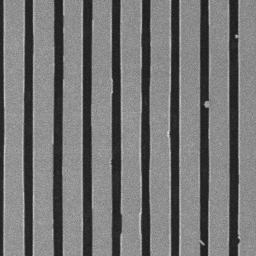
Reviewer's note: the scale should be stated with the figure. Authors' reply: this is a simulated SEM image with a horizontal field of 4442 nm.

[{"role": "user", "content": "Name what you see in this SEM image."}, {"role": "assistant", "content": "parallel lines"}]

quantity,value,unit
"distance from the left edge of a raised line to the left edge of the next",509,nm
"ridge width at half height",338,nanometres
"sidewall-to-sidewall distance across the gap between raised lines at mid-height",169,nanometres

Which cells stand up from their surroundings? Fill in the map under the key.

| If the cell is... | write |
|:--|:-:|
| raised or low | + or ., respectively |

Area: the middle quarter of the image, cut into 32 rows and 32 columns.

+++++..+++++..+++++...+++++..+++
+++++..+++++..+++++...+++++..+++
+++++..+++++..+++++...+++++..+++
+++++..+++++..+++++...++++...+++
+++++..+++++..+++++...++++...+++
+++++..+++++..+++++..+++++...+++
+++++..+++++..+++++..+++++...+++
+++++..+++++..+++++..+++++...+++
+++++..+++++..+++++..+++++...+++
+++++..+++++..+++++..+++++...+++
+++++..+++++..+++++..+++++...+++
+++++..+++++..+++++..+++++...+++
++++...+++++..+++++..+++++...+++
++++...+++++..+++++..+++++...+++
++++...+++++..+++++..+++++...+++
++++...+++++..+++++..+++++...+++
++++...+++++..+++++...++++...+++
++++...+++++..+++++...++++...+++
++++...+++++..+++++...++++...+++
++++...+++++..+++++...++++...+++
++++...+++++..+++++...++++...+++
++++...+++++..+++++...++++...+++
++++...+++++..+++++...++++...+++
++++...+++++..+++++...++++...+++
++++...+++++..+++++..+++++...+++
++++...+++++..+++++..+++++...+++
++++...+++++..+++++..+++++...+++
++++...+++++..+++++..++++++..+++
++++...+++++..+++++..++++++..+++
++++...+++++..+++++..++++++..+++
++++...+++++..+++++..++++++..+++
++++...+++++..+++++..++++++..+++